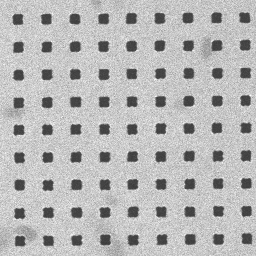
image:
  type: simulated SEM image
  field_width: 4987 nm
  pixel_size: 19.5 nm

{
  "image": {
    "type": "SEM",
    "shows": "a regular array of holes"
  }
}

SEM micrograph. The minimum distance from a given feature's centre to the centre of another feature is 535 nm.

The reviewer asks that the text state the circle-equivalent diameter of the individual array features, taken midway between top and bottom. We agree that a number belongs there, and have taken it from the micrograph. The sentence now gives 230 nm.